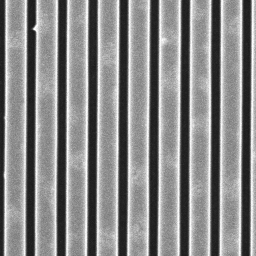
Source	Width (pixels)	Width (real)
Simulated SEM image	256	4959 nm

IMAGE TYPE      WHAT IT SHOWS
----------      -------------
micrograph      parallel lines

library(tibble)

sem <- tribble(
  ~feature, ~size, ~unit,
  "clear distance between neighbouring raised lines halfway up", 8.63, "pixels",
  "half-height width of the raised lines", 421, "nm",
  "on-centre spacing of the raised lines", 596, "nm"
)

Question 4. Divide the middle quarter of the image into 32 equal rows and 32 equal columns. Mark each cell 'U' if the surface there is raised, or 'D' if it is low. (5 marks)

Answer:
DUUUUUDDUUUUUUDDUUUUUDDDUUUUUDDU
DUUUUUDDUUUUUUDDUUUUUDDDUUUUUDDU
DUUUUUDDUUUUUUDDUUUUUDDDUUUUUDDU
DUUUUUDDUUUUUUDDUUUUUDDDUUUUUDDU
DUUUUUDDUUUUUUDDUUUUUDDDUUUUUDDU
DUUUUUDDUUUUUUDDUUUUUDDDUUUUUDDU
DUUUUUDDUUUUUUDDUUUUUDDDUUUUUDDU
DUUUUUDDUUUUUUDDUUUUUDDDUUUUUDDU
DUUUUUDDUUUUUUDDUUUUUDDDUUUUUDDU
DUUUUUDDUUUUUUDDUUUUUDDDUUUUUDDU
DUUUUUDDUUUUUUDDUUUUUDDDUUUUUDDU
DUUUUUDDUUUUUUDDUUUUUDDDUUUUUDDU
DUUUUUDDUUUUUUDDUUUUUDDDUUUUUDDU
DUUUUUDDUUUUUUDDUUUUUDDDUUUUUDDU
DUUUUUDDUUUUUUDDUUUUUDDDUUUUUDDU
DUUUUUDDUUUUUUDDUUUUUDDDUUUUUDDU
DUUUUUDDUUUUUUDDUUUUUDDDUUUUUDDU
DUUUUUDDUUUUUUDDUUUUUDDDUUUUUDDU
DUUUUUDDUUUUUUDDUUUUUDDDUUUUUDDU
DUUUUUDDUUUUUUDDUUUUUDDDUUUUUDDU
DUUUUUDDUUUUUDDDUUUUUDDDUUUUUDDU
DUUUUUDDUUUUUDDDUUUUUDDDUUUUUDDU
DUUUUUDDUUUUUDDDUUUUUDDDUUUUUDDU
DUUUUUDDUUUUUDDDUUUUUDDDUUUUUDDU
DUUUUUDDUUUUUDDDUUUUUDDDUUUUUDDU
DUUUUUDDUUUUUDDDUUUUUDDDUUUUUDDU
DUUUUUDDUUUUUDDDUUUUUDDDUUUUUDDU
DUUUUUDDUUUUUDDDUUUUUDDDUUUUUDDU
DUUUUUDDUUUUUDDDUUUUUDDDUUUUUDDU
DUUUUUDDUUUUUDDDUUUUUDDDUUUUUDDU
DUUUUUDDUUUUUDDDUUUUUDDDUUUUUDDU
DUUUUUDDUUUUUDDDUUUUUDDDUUUUUDDU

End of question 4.